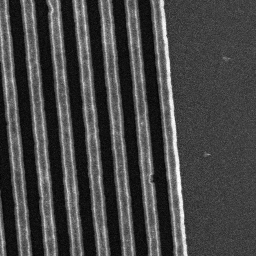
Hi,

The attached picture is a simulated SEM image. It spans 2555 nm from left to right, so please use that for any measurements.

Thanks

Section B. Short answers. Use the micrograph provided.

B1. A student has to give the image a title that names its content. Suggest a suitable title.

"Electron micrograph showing parallel lines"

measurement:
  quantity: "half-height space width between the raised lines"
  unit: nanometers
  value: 158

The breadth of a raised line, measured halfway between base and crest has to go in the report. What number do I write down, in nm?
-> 99.4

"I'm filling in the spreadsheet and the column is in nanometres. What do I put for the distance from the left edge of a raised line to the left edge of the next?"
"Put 257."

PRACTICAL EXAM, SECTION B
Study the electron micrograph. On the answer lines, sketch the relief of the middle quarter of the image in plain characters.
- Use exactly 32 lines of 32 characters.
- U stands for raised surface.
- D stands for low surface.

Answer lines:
DDDDUUDDDDDUUDDDDUUUDDDDUUDDDDDD
DDDDUUUDDDUUUDDDDUUDDDDDUUDDDDDD
DDDDUUUDDDDUUDDDDUUUDDDDUUDDDDDD
DDDDUUUDDDDUUDDDDUUUDDDDUUDDDDDD
DDDDDUUDDDDUUDDDDDUUDDDDUUDDDDDD
DDDDDUUDDDDUUUDDDDUUDDDDUUDDDDDD
UDDDDUUDDDDUUDDDDDUUDDDDUUUDDDDD
UDDDDUUDDDDUUUDDDDUUDDDDUUUDDDDD
UDDDDUUDDDDUUUDDDDUUDDDDUUUDDDDD
UDDDDUUDDDDUUUDDDDUUDDDDUUUDDDDD
UDDDDUUDDDDUUUDDDDUUUDDDUUUDDDDD
UDDDDUUUDDDUUUDDDDUUUDDDDUUDDDDD
UDDDDUUUDDDDUUDDDDUUUDDDDUUDDDDD
UDDDDUUUDDDDUUDDDDUUUDDDDUUDDDDD
UDDDDUUUDDDDUUDDDDUUUDDDDUUDDDDD
UDDDDDUUDDDDUUUDDDUUUDDDDUUDDDDD
UUDDDDUUDDDDUUDDDDDUUDDDDUUUDDDD
UUDDDDUUDDDDUUUDDDDUUDDDDUUUDDDD
UUDDDDUUDDDDUUUDDDDUUDDDDUUUDDDD
UUDDDDUUDDDDUUUDDDDUUDDDDUUUDDDD
UUDDDDUUUDDDUUUDDDDUUDDDDUUUDDDD
UUDDDDUUUDDDUUUDDDDUUUDDDDUUDDDD
UUDDDDUUUDDDDUUDDDDUUDDDDDUUDDDD
UUDDDDUUUDDDDUUDDDDUUUDDDDUUDDDD
UUDDDDUUUDDDDUUDDDDUUUDDDDUUDDDD
UUDDDDUUUDDDDUUDDDDUUUDDDDUUDDDD
UUUDDDUUUDDDDUUDDDDDUUDDDDUUDDDD
UUUDDDUUUDDDDUUDDDDDUUDDDDUUDDDD
UUUDDDDUUDDDDUUUDDDDUUDDDDUUUDDD
UUUDDDDUUDDDDUUUDDDDUUDDDDUUUDDD
UUUDDDDUUDDDDUUUDDDDUUDDDDUUUDDD
DUUDDDDUUDDDDDUUDDDDUUDDDDUUUDDD